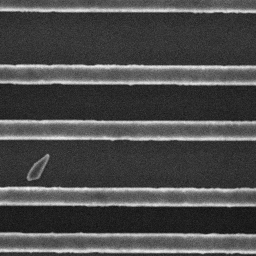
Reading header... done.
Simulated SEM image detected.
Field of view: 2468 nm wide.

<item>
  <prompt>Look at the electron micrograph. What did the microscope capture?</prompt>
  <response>lines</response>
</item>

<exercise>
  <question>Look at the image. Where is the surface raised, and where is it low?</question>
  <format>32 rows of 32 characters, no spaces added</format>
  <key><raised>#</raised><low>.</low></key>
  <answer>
################################
..............................##
................................
................................
................................
................................
................................
................................
################################
################################
................#......#########
................................
................................
................................
................................
################################
################################
................###.#.##########
................................
................................
................................
................................
................................
#######.........................
################################
################################
................................
................................
................................
################################
################################
.......#.##..####.##############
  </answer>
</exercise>